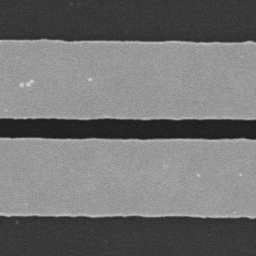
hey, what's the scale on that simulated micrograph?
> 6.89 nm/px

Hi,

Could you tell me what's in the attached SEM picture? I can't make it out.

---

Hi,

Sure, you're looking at lines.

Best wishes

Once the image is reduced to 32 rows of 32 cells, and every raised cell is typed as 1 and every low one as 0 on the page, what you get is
00000000000000000000000000000000
00000000000000000000000000000000
00000000000000000000000000000000
00000000000000000000000000000000
00000000000000000000000000000000
11111111111111111111111111111111
11111111111111111111111111111111
11111111111111111111111111111111
11111111111111111111111111111111
11111111111111111111111111111111
11111111111111111111111111111111
11111111111111111111111111111111
11111111111111111111111111111111
11111111111111111111111111111111
11111111111111111111111111111111
00000000000000000000000000000000
00000000000000000000000000000000
11111111111111001001111111001110
11111111111111111111111111111111
11111111111111111111111111111111
11111111111111111111111111111111
11111111111111111111111111111111
11111111111111111111111111111111
11111111111111111111111111111111
11111111111111111111111111111111
11111111111111111111111111111111
11111111111111111111111111111111
00000000000000000000000000000000
00000000000000000000000000000000
00000000000000000000000000000000
00000000000000000000000000000000
00000000000000000000000000000000